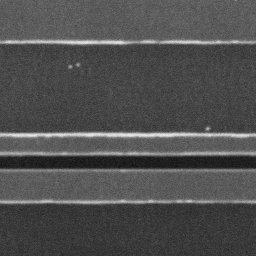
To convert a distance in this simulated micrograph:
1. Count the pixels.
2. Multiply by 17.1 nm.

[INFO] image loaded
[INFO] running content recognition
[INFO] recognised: lines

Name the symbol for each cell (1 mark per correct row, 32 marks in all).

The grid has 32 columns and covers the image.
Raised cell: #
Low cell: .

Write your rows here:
################################
################################
################################
################################
################################
................................
................................
................................
................................
................................
................................
................................
................................
................................
................................
................................
................................
################################
################################
###.................#..........#
................................
################################
################################
################################
################################
................................
................................
................................
................................
................................
................................
................................